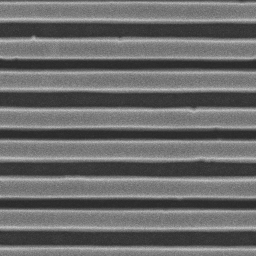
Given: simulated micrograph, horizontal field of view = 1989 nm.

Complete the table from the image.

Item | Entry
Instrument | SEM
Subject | parallel lines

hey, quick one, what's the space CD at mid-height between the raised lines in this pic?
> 122 nm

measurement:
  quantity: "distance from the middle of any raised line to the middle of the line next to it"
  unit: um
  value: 0.268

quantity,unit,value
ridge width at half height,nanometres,161